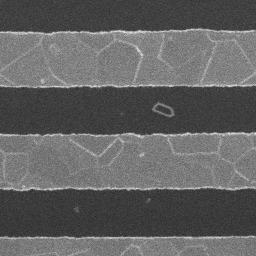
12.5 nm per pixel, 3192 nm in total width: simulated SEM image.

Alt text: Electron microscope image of one or a few lines or trenches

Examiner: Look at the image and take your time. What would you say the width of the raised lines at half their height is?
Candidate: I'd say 681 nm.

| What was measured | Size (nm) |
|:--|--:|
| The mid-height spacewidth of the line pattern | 605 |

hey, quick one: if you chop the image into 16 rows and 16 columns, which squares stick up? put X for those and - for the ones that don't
----------------
----------------
XXXXXXXXXXXXXXXX
XXXXXXXXXXXXXXXX
XXXXXXXXXXXXXXXX
----------------
----------------
----------------
XXXXXXXXXXXXXXXX
XXXXXXXXXXXXXXXX
XXXXXXXXXXXXXXXX
XXXXXXXXXXXXXXXX
----------------
----------------
----------------
XXXXXXXXXXXXXXXX